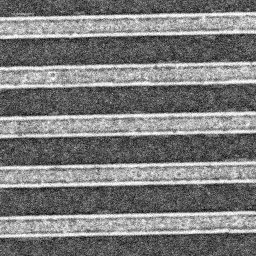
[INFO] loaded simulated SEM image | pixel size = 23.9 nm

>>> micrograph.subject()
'parallel lines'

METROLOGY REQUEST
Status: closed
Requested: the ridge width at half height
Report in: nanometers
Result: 431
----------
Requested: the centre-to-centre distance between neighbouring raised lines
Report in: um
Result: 1.19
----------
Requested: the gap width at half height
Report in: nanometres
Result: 751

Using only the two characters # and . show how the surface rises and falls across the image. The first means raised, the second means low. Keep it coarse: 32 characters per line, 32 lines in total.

................................
................................
################################
################################
####....#.......................
................................
................................
................................
.....###########################
################################
#################...............
................................
................................
................................
...................#############
################################
##########################..#...
................................
................................
................................
...........................#####
################################
################################
................................
................................
................................
................................
################################
################################
................................
................................
................................